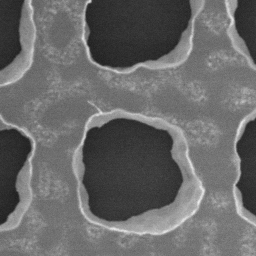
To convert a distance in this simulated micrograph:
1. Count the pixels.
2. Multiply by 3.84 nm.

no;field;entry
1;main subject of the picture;holes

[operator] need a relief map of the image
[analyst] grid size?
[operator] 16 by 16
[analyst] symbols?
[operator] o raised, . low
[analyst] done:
..ooo.......ooo.
..ooo.......ooo.
..ooo.......ooo.
.ooooo.....oooo.
.ooooooooooooooo
oooooooooooooooo
oooooooooooooooo
ooooooo.oooooooo
..ooo......oooo.
..ooo......oooo.
..ooo.......ooo.
.oooo.......ooo.
.oooo......oooo.
.ooooo.....ooooo
oooooooooooooooo
oooooooooooooooo